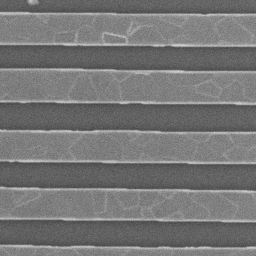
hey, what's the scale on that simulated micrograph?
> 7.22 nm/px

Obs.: lines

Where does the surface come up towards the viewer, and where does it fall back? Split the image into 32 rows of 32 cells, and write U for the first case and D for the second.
DDDDDDDDDDDDDDDDDDDDDDDDDDDDDDDD
DDDDDDDDDDDDDDDDDDDDDDDDDDDDDDDD
UUUUUUUUUUUUUUUUUUUUUUUUUUUUUUUU
UUUUUUUUUUUUUUUUUUUUUUUUUUUUUUUU
UUUUUUUUUUUUUUUUUUUUUUUUUUUUUUUU
UUUUUUUUUUUUUUUUUUUUUUUUUUUUUUUU
DDDDDDDDDDDDDDDDDDDDDDDDDDDDDDDD
DDDDDDDDDDDDDDDDDDDDDDDDDDDDDDDD
DDDDDDDDDDDDDDDDDDDDDDDDDDDDDDDD
UUUUUUUUUUUUUUUUUUUUUUUUUUUUUUUU
UUUUUUUUUUUUUUUUUUUUUUUUUUUUUUUU
UUUUUUUUUUUUUUUUUUUUUUUUUUUUUUUU
UUUUUUUUUUUUUUUUUUUUUUUUUUUUUUUU
DDDDDDDDDDDDDDDDDDDDDDDDDDDDDDDD
DDDDDDDDDDDDDDDDDDDDDDDDDDDDDDDD
DDDDDDDDDDDDDDDDDDDDDDDDDDDDDDDD
UUUUUUUUUUUUUUUUUUUUDDDDDDDDDDDD
UUUUUUUUUUUUUUUUUUUUUUUUUUUUUUUU
UUUUUUUUUUUUUUUUUUUUUUUUUUUUUUUU
UUUUUUUUUUUUUUUUUUUUUUUUUUUUUUUU
DDDDDDDDDDDDDDDDDDDDDDDDDDDDDDDD
DDDDDDDDDDDDDDDDDDDDDDDDDDDDDDDD
DDDDDDDDDDDDDDDDDDDDDDDDDDDDDDDD
UDDDDDDDDDDDDDDDDDDDDDDDDDDDDDDD
UUUUUUUUUUUUUUUUUUUUUUUUUUUUUUUU
UUUUUUUUUUUUUUUUUUUUUUUUUUUUUUUU
UUUUUUUUUUUUUUUUUUUUUUUUUUUUUUUU
DDDDDDDDDDDDDDDDDDDDUUUUUUUUUUUU
DDDDDDDDDDDDDDDDDDDDDDDDDDDDDDDD
DDDDDDDDDDDDDDDDDDDDDDDDDDDDDDDD
DDDDDDDDDDDDDDDDDDDDDDDDDDDDDDDD
UUUUUUUUUUUUUUUUUUUUUUUUUUUUUUUU